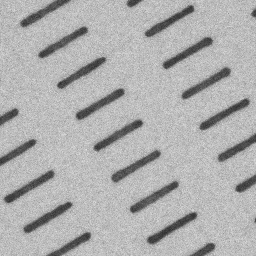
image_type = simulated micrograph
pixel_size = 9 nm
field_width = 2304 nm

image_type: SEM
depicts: a regular array of holes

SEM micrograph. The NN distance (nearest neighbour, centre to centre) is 0.322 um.